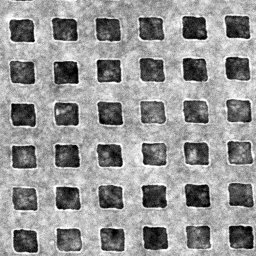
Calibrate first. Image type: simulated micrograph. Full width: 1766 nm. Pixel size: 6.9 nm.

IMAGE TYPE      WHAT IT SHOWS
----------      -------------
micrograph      a regular array of holes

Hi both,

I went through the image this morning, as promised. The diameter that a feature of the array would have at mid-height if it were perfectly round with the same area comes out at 186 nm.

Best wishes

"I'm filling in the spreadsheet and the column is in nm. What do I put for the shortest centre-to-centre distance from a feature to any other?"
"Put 289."